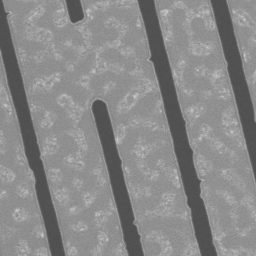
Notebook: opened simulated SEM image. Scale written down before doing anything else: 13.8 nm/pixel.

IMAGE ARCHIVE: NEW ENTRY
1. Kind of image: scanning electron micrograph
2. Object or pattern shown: one or a few lines or trenches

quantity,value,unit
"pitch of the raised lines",72.3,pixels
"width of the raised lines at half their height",0.239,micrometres